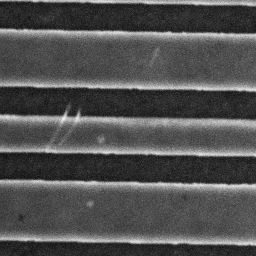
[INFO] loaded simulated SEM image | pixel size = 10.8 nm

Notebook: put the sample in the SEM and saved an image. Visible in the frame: lines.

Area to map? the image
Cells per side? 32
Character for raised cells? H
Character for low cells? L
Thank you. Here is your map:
LLLLLLLLLLLLLLLLLLLLLLLLLHHHHHHH
LLLLLLLLLLLLLLLLLLLLLLLLLLLLLLLL
LLLLLLLLLLLLLLLLLLLLLLLLLLLLLLLL
LLLLLLLLLLLLLLLLLLLLLLLLLLLLLLLL
HHHHHHHHHHHHHHHHHHHHHHHHHHHHHHHH
HHHHHHHHHHHHHHHHHHHHHHHHHHHHHHHH
HHHHHHHHHHHHHHHHHHHHHHHHHHHHHHHH
HHHHHHHHHHHHHHHHHHHHHHHHHHHHHHHH
HHHHHHHHHHHHHHHHHHHHHHHHHHHHHHHH
HHHHHHHHHHHHHHHHHHHHHHHHHHHHHHHH
HHHHHHHHHHHHHHHHHHHHHHHHHHHHHHHH
LLLLLLLLLLLLLLLLLLLLLLLLLLLLLLLL
LLLLLLLLLLLLLLLLLLLLLLLLLLLLLLLL
LLLLLLLLLLLLLLLLLLLLLLLLLLLLLLLL
LLLLLLLLLLLLLLLLLLLLLLLLLLLLLLLL
HHHHHHHHHHHHHHHHHHHHHHHHHHHHHHHH
HHHHHHHHHHHHHHHHHHHHHHHHHHHHHHHH
HHHHHHHHHHHHHHHHHHHHHHHHHHHHHHHH
HHHHHHHHHHHHHHHHHHHHHHHHHHHHHHHH
LLLLLLLLLLLLLLLLLLLLLLLLLLLLLLLL
LLLLLLLLLLLLLLLLLLLLLLLLLLLLLLLL
LLLLLLLLLLLLLLLLLLLLLLLLLLLLLLLL
LLLLLLLLLLLLLLLLLLLLLLLLLLLLLLLL
HHHHHHHHHHHHHHHHHHHHHHHHHHHHHHHH
HHHHHHHHHHHHHHHHHHHHHHHHHHHHHHHH
HHHHHHHHHHHHHHHHHHHHHHHHHHHHHHHH
HHHHHHHHHHHHHHHHHHHHHHHHHHHHHHHH
HHHHHHHHHHHHHHHHHHHHHHHHHHHHHHHH
HHHHHHHHHHHHHHHHHHHHHHHHHHHHHHHH
HHHHHHHHHHHHHHHHHHHHHHHHHHHHHHHH
LLLLLLLLLLLLLLLLLLLLLLLLLLLLLHHH
LLLLLLLLLLLLLLLLLLLLLLLLLLLLLLLL